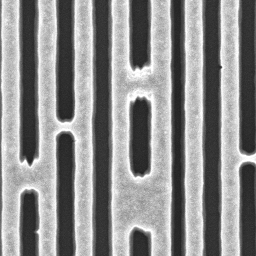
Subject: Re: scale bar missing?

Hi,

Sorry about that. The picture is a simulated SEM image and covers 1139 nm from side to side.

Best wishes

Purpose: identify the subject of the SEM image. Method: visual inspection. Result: parallel lines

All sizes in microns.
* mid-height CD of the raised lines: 0.0872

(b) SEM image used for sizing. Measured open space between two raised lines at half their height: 74.5 nm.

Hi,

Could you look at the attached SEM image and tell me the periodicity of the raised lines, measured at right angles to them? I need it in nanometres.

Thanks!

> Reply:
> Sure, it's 162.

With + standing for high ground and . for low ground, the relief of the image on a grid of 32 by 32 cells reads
++...++..+++..++...++..++...++..
++...++..+++..++...++..++..+++..
++...++..+++..++...++..++...++..
++...++..+++..++...++..++...++..
++...++..+++..++...++..++...++..
+++..++..+++..++...++..++...++..
+++..++..+++..++...++..++...++..
+++..++..+++..++...++..++...++..
+++..++..+++..+++.+++..++...++..
+++..++..+++..+++++++..++...++..
+++..++..+++..+++++++..++...++..
+++..++..+++..+++++++..++...++..
+++..++..+++..+++.+++..++...++..
+++..++..+++..++...++..++...++..
+++..++..+++..++...++..++...++..
+++..+++++++..++...++..++...++..
+++..+++++++..++...++..++...++..
+++..++..+++..++...++..++...++..
+++..++..+++..++...++..++...++..
+++..++..+++..++...+++.++...++++
+++++++..+++..++...++..++...++..
+++++++..+++..+++..++..++...++..
+++++++..+++..+++++++..++...++..
+++++++..+++..+++++++..++...++..
+++..++..+++..+++++++..++...++..
+++..++..+++..+++++++..++...++..
+++..++..+++..+++++++..++...++..
+++..++..+++..+++++++..++...++..
++...++..+++..+++++++..++...++..
+++..++..+++..++...++..++...++..
+++..++..+++..++...++..++...++..
+++..++..+++..++...++..++...++..